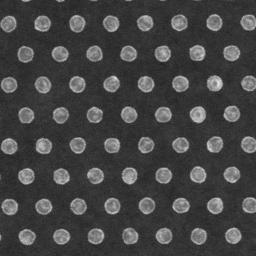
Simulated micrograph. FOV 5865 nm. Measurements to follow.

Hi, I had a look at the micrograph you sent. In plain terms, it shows a regular array of raised bodies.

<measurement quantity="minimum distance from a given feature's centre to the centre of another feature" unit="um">0.779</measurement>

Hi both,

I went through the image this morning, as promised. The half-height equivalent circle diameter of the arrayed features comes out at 0.348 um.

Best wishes